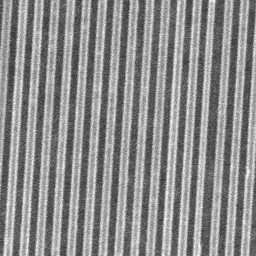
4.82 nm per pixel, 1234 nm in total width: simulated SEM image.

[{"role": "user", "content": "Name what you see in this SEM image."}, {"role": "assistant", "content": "parallel lines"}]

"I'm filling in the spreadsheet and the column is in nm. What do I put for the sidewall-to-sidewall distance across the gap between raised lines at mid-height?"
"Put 41.5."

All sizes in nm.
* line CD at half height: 32.5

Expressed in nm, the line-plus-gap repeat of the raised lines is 76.